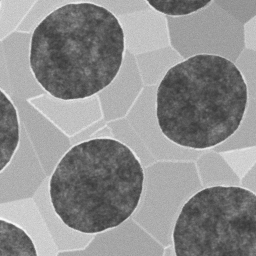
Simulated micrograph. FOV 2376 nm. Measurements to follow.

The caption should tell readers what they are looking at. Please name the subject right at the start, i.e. holes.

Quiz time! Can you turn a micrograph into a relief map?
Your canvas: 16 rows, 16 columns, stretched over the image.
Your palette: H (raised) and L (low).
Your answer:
HHHHLLHHHHLLLHHH
HHLLLLLHHHHHHHHH
HHLLLLLLHHHHHHHH
HHLLLLLLHHHHLLHH
HHLLLLLHHHHLLLLH
HHHLLLHHHHLLLLLH
LHHHHHHHHHLLLLLH
LHHHHHHHHHLLLLLH
LHHHHHHHHHLLLLHH
LHHHLLLLHHHHHHHH
HHHLLLLLLHHHHHHH
HHHLLLLLLHHHHHHH
HHHLLLLLLHHHLLLL
HHHHLLLLHHHLLLLL
LLHHHLHHHHHLLLLL
LLHHHHHHHHHLLLLL